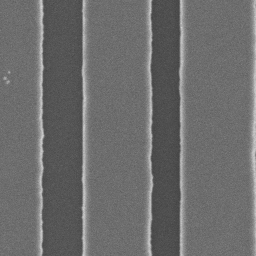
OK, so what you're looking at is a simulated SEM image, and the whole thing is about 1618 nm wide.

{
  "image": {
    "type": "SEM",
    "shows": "lines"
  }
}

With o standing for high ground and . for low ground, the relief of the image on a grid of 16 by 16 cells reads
ooo..oooo..ooooo
ooo..oooo..ooooo
ooo..oooo..ooooo
ooo..oooo..ooooo
ooo..oooo..ooooo
ooo..oooo..ooooo
ooo..oooo..ooooo
ooo..oooo..ooooo
ooo..oooo..ooooo
ooo..oooo..ooooo
ooo..oooo..ooooo
ooo..ooooo.ooooo
ooo..oooo..ooooo
ooo..oooo..ooooo
ooo..oooo..ooooo
ooo..oooo..ooooo